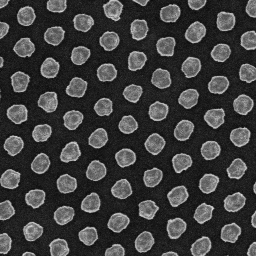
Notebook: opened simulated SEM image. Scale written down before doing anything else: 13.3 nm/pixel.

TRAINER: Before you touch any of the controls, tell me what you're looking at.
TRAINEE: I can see a regular array of raised bodies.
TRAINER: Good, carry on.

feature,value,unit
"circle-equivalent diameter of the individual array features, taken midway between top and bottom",248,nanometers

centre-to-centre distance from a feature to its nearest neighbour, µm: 0.418